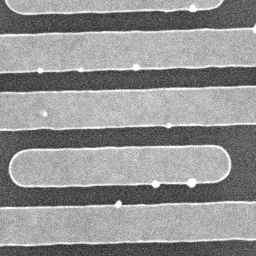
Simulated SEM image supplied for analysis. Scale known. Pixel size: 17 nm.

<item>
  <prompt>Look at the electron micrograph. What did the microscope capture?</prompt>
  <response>groups of lines, slits or small figures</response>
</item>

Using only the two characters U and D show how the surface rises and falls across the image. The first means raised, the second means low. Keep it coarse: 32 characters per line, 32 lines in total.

DUUUUUUUUUUUUUUUUUUUUUUUUUUDDDDD
DDUUUUUUUUUUUUDDDDDDDDDDDDDDDDDD
DDDDDDDDDDDDDDDDDDDDDDDDDDDDDDDD
DDDDDDDDDDDDDDDDDDDDDDDDDDDDDDDD
UUUUUUUUUUUUUUUUUUUUUUUUUUUUUUUU
UUUUUUUUUUUUUUUUUUUUUUUUUUUUUUUU
UUUUUUUUUUUUUUUUUUUUUUUUUUUUUUUU
UUUUUUUUUUUUUUUUUUUUUUUUUUUUUUUU
UUUUUUUUUUUUUUUUUUUUUDDDDDDDDDDD
DDDDDDDDDDDDDDDDDDDDDDDDDDDDDDDD
DDDDDDDDDDDDDDDDDDDDDDDDDDDDDDDD
DDDDDDDUUUUUUUUUUUUUUUUUUUUUUUUU
UUUUUUUUUUUUUUUUUUUUUUUUUUUUUUUU
UUUUUUUUUUUUUUUUUUUUUUUUUUUUUUUU
UUUUUUUUUUUUUUUUUUUUUUUUUUUUUUUU
UUUUUUUUUUUUUUUUUUUUUUUUUUUUUDDD
DDDDDDDDDDDDDDDDDDDDDDDDDDDDDDDD
DDDDDDDDDDDDDDDDDDDDDDDDDDDDDDDD
DDDDDDDDDDDDUUUUUUUUUUUUUUUUDDDD
DDUUUUUUUUUUUUUUUUUUUUUUUUUUDDDD
DUUUUUUUUUUUUUUUUUUUUUUUUUUUUDDD
DUUUUUUUUUUUUUUUUUUUUUUUUUUUUDDD
DDUUUUUUUUUUUUUUUUUUUUUUUUUUDDDD
DDDDDDDDDDDDDDDDDDDDDDDDDDDDDDDD
DDDDDDDDDDDDDDDDDDDDDDDDDDDDDDDD
DDDDDDDDDDDDDDDDDDDDDDDDDUUUUUUU
UUUUUUUUUUUUUUUUUUUUUUUUUUUUUUUU
UUUUUUUUUUUUUUUUUUUUUUUUUUUUUUUU
UUUUUUUUUUUUUUUUUUUUUUUUUUUUUUUU
UUUUUUUUUUUUUUUUUUUUUUUUUUUUUUUU
UUUUUUUDDDDDDDDDDDDDDDDDDDDDDDDD
DDDDDDDDDDDDDDDDDDDDDDDDDDDDDDDD